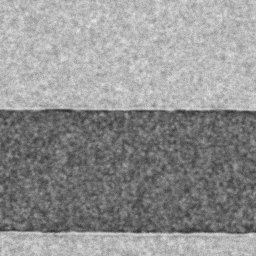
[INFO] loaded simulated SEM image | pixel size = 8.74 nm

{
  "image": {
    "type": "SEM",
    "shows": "one or a few lines or trenches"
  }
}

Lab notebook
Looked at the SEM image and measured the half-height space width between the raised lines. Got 1080 nanometers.